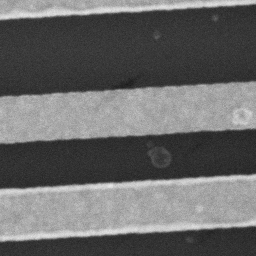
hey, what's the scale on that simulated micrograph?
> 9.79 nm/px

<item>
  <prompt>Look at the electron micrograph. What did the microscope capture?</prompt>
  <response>lines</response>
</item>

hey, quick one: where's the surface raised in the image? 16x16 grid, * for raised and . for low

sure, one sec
***********.....
................
................
................
................
..........******
****************
****************
*******.........
................
................
.......*********
****************
****************
********........
................